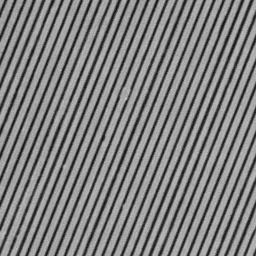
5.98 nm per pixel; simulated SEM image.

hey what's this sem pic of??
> parallel lines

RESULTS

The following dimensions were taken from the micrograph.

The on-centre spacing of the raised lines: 52.6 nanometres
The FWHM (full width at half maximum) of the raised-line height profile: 35.4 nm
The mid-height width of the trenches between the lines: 0.018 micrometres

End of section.